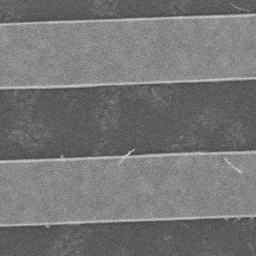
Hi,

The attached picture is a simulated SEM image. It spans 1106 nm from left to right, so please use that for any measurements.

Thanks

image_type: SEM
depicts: one or a few lines or trenches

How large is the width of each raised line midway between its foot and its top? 276 nanometers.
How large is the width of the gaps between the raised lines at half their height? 315 nanometres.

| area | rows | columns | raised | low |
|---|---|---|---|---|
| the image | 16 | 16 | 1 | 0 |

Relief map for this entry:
0000000000000000
0111111111111111
1111111111111111
1111111111111111
1111111111111111
0000000000000000
0000000000000000
0000000000000000
0000000000000000
0000000000000000
1111111111111111
1111111111111111
1111111111111111
1111111111111111
0000000000000000
0000000000000000